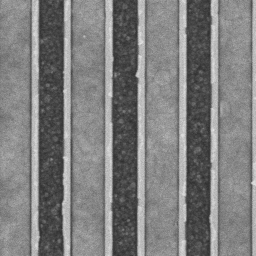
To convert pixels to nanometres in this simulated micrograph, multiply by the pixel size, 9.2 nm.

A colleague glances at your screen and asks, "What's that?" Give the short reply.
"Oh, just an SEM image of one or a few lines or trenches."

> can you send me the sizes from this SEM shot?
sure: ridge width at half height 0.316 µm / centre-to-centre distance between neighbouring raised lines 679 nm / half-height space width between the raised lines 363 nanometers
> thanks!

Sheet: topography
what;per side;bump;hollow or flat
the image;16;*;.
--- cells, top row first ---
..**...**..**...
..**...**..**...
..**...**..**...
..**...**..**...
..**...**..**...
..**...**..**...
..**...**..**...
..**...**..**...
..**...**..**...
..**...**..**...
..**...**..**...
..**...**..**...
..**...**..**...
..**...**..**...
..**...**..**...
..**...**..**...